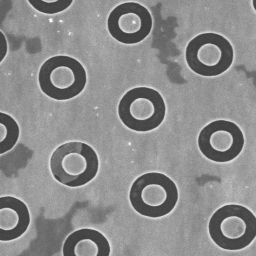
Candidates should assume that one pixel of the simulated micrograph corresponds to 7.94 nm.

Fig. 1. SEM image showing ring-shaped grooves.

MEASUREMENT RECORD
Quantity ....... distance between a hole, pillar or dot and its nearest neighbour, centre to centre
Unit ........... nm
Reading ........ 676